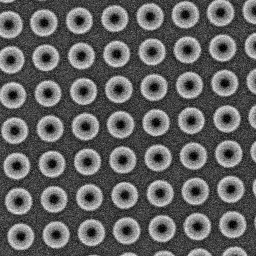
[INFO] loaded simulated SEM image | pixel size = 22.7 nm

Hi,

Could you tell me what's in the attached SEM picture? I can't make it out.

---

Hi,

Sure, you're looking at an array of small figures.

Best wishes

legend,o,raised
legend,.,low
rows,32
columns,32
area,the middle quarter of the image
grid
..oooo......oo..................
................................
..............................oo
............ooo.....ooooo....ooo
...oooo....ooooo....ooooo...oooo
..oooooo...oooooo..ooooooo..oooo
..oooooo..ooooooo..ooooooo..oooo
..oooooo...oooooo...ooooo....ooo
..oooooo...ooooo.....ooo........
...oooo......oo.................
................................
......................o.......oo
.....o......oooo.....oooo....ooo
...ooooo...oooooo...oooooo...ooo
..oooooo...oooooo...oooooo...ooo
..ooooooo..oooooo...oooooo...ooo
..ooooooo..oooooo...oooooo....oo
...ooooo....oooo.....oooo.......
....ooo.........................
................................
......................ooo.....oo
.....oo......oooo....ooooo...ooo
...ooooo....oooooo..ooooooo..ooo
...oooooo...oooooo..ooooooo..ooo
...oooooo...oooooo..ooooooo..ooo
...oooooo...oooooo...ooooo....oo
...ooooo.....oooo.....ooo.......
.....oo.........................
................................
.......................oo......o
.....ooo.....oooo....oooooo...oo
....ooooo...oooooo...oooooo...oo